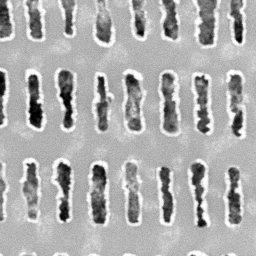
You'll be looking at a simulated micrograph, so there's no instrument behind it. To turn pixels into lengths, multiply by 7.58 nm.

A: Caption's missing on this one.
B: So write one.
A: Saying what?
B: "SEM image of a regular array of holes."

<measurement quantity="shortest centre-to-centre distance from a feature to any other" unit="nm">250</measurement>